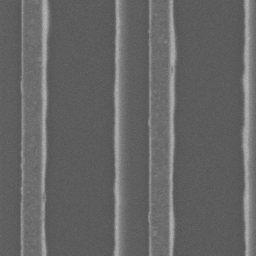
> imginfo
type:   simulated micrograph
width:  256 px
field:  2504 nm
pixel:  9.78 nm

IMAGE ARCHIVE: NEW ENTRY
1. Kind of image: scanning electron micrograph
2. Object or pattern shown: lines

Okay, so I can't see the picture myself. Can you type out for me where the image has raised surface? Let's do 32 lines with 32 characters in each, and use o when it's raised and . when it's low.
ooooo..........oooooo..........o
ooooo..........oooooo..........o
ooooo..........oooooo..........o
ooooo..........oooooo..........o
ooooo..........oooooo..........o
ooooo..........oooooo..........o
ooooo..........oooooo..........o
ooooo..........oooooo..........o
ooooo..........ooooooo.........o
ooooo..........ooooooo.........o
ooooo..........oooooo..........o
ooooo..........oooooo..........o
ooooo..........oooooo..........o
ooooo..........oooooo..........o
ooooo..........oooooo..........o
ooooo..........oooooo..........o
ooooo..........oooooo..........o
ooooo..........oooooo..........o
ooooo..........oooooo..........o
ooooo..........oooooo..........o
ooooo..........oooooo..........o
ooooo..........oooooo..........o
ooooo..........oooooo..........o
ooooo..........oooooo..........o
oooooo.........oooooo..........o
ooooo..........oooooo..........o
ooooo..........oooooo..........o
ooooo..........oooooo..........o
ooooo..........oooooo..........o
ooooo..........oooooo..........o
ooooo..........oooooo..........o
ooooo..........oooooo..........o